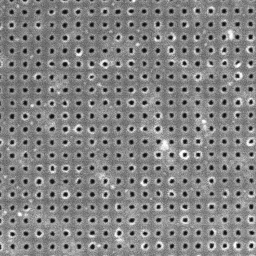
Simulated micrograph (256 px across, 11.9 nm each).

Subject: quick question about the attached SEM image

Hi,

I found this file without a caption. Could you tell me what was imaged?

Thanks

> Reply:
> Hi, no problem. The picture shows a regular array of holes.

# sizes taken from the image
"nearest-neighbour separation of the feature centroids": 152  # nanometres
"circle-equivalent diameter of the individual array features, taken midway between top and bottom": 61.4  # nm